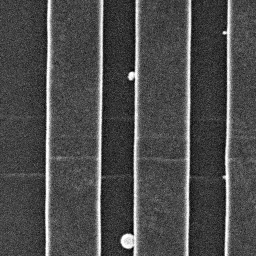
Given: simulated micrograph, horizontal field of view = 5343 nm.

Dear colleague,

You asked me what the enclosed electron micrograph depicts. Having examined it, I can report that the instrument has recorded wiring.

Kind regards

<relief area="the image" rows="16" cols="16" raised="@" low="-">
---@@@---@@@--@@
---@@@---@@@--@@
---@@@---@@@--@@
---@@@---@@@--@@
---@@@--@@@@--@@
---@@@--@@@@--@@
---@@@--@@@@--@@
---@@@--@@@@--@@
---@@@--@@@@--@@
---@@@--@@@@--@@
---@@@--@@@@--@@
---@@@--@@@@--@@
---@@@--@@@@--@@
---@@@--@@@@--@@
---@@@--@@@@--@@
---@@@--@@@@--@@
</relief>